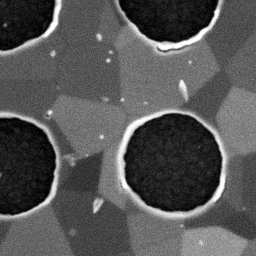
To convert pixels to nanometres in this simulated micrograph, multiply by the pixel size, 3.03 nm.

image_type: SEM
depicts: holes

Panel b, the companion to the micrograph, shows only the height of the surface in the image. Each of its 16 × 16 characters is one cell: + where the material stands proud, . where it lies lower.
...+++++......++
...+++++.....+++
..++++++++..++++
++++++++++++++++
++++++++++++++++
++++++++++++++++
++++++++++++++++
.++++++++...++++
...+++++.....+++
...+++++......++
...+++++......++
...+++++......++
...++++++....+++
++++++++++++++++
++++++++++++++++
++++++++++++++++